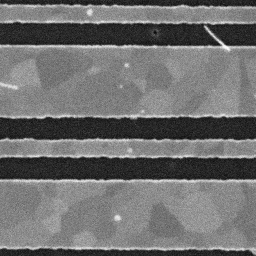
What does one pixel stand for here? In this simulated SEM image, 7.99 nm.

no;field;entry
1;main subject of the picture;lines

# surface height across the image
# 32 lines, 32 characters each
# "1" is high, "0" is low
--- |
00000000000000000000000000000000
11111111111111111111111111111111
11111111111111111111111111111111
00000000000000000000000000000000
00000000000000000000000000000000
00000000000000000000000000000000
11111111111111111111111111111111
11111111111111111111111111111111
11111111111111111111111111111111
11111111111111111111111111111111
11111111111111111111111111111111
11111111111111111111111111111111
11111111111111111111111111111111
11111111111111111111111111111111
11111111111111111111111111111111
00000000000000000000000000000000
00000000000000000000000000000000
11111000110111111100110101111011
11111111111111111111111111111111
11111011111111111111111111111111
00000000000000000000000000000000
00000000000000000000000000000000
00000000000000000000000000000000
11111111111111111111111111111111
11111111111111111111111111111111
11111111111111111111111111111111
11111111111111111111111111111111
11111111111111111111111111111111
11111111111111111111111111111111
11111111111111111111111111111111
11111111111111111111111111111111
00000000000000000000000000000000